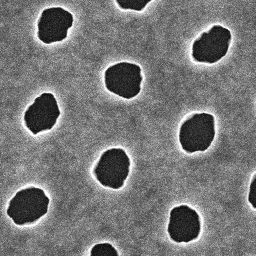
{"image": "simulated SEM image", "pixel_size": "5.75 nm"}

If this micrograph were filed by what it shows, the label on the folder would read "a regular array of holes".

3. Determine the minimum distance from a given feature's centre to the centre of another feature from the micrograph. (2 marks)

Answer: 88.6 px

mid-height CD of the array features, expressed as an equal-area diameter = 215 nanometers